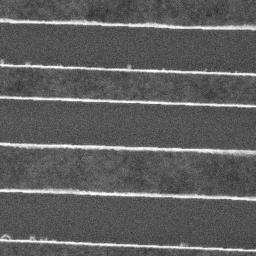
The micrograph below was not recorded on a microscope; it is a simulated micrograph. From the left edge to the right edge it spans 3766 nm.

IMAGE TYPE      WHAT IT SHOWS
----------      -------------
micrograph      lines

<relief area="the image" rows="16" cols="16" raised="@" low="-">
@@@@@@@@@@@@@@@@
------@@@@@@@@@@
----------------
----------------
@@@@@@@@@@@-----
@@@@@@@@@@@@@@@@
------------@@@@
----------------
----------------
@@@@@@@@@@@@@@@-
@@@@@@@@@@@@@@@@
@@@@@@@@@@@@@@@@
----------------
----------------
----------------
@@@@@@@@@@@@----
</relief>